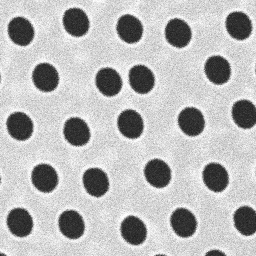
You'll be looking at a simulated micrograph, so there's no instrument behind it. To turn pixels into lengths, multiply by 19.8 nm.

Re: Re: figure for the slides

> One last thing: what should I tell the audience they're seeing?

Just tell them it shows a regular array of holes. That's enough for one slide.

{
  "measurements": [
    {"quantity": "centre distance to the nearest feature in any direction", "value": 1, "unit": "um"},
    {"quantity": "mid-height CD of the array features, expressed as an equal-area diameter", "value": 586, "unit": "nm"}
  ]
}